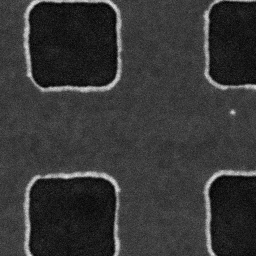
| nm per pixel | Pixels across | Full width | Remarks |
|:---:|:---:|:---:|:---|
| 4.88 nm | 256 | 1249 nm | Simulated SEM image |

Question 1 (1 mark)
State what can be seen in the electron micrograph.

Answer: holes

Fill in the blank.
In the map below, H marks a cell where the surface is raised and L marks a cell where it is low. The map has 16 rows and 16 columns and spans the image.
HHLLLLLHHHHHHLLL
HHLLLLLHHHHHHLLL
HHLLLLLHHHHHHLLL
HHLLLLLHHHHHHLLL
HHLLLLLHHHHHHLLL
HHHHHHHHHHHHHHHH
HHHHHHHHHHHHHHHH
HHHHHHHHHHHHHHHH
HHHHHHHHHHHHHHHH
HHHHHHHHHHHHHHHH
HHHHHHHHHHHHHHHH
HHLLLLLHHHHHHLLL
HHLLLLLHHHHHHLLL
HHLLLLLHHHHHHLLL
HHLLLLLHHHHHHLLL
HHLLLLLHHHHHHLLL